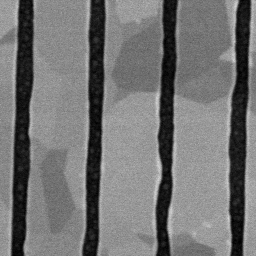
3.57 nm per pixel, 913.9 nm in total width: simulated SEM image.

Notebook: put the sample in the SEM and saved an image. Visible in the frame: one or a few lines or trenches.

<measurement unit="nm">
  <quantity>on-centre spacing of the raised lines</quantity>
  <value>257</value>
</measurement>